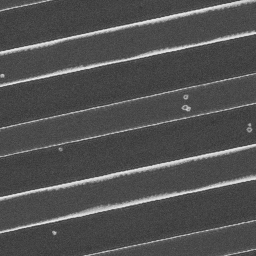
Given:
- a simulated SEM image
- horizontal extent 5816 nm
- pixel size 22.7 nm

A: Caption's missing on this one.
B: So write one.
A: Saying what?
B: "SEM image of lines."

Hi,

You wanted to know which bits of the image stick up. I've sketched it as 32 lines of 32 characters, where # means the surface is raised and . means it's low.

####.........................###
........................########
...................#############
...............#################
..........####################..
.....####################.......
####################............
################................
###########.....................
######........................##
#.........................######
.....................###########
................################
............#################...
.......##################.......
...#################............
###############.................
##########......................
#####.........................##
.........................#######
.....................###########
................################
...........####################.
......####################......
.####################...........
################................
############....................
#######.........................
###........................#####
.......................#########
..................##############
.............#################..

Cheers